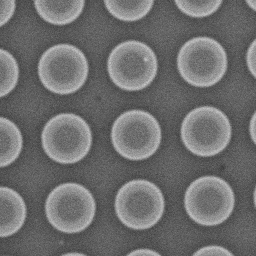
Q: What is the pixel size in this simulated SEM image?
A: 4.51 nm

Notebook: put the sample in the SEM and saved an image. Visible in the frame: an array of small figures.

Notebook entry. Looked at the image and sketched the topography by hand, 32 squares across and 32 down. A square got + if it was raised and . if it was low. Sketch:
++..++++++...++++++...+++++....+
++...+++++....++++.....++++.....
+.....+++......++...............
................................
................................
...............+++.....++++.....
+.....++++....+++++...++++++...+
++...++++++...++++++..++++++...+
++...++++++...++++++..++++++...+
++...++++++...+++++....+++++....
++...+++++.....++++.....+++.....
+......++.......................
................................
.........................++.....
.......+++.....++++....+++++....
++....+++++...++++++...++++++..+
++...++++++...++++++...++++++..+
+++..++++++...++++++...++++++...
+++..++++++...++++++...+++++....
++....++++.....++++.............
+...............................
................................
.........................+++....
+......+++.....+++++....+++++...
++....+++++....+++++...++++++...
+++...++++++..++++++...++++++...
+++...++++++...+++++...++++++...
+++...+++++....+++++....++++....
++.....++++......+..............
+...............................
................................
.................++......++++...